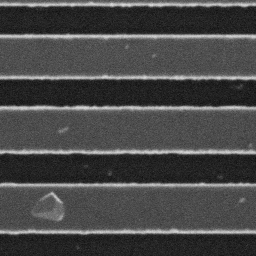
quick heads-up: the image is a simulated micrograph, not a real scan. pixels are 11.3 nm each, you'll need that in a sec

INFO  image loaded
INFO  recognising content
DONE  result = lines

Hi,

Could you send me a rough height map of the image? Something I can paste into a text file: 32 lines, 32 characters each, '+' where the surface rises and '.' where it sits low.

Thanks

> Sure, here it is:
++++++++++++++++++++++++++++++++
................................
................................
................................
++++++++++++++++++++++++++++++++
++++++++++++++++++++++++++++++++
++++++++++++++++++++++++++++++++
++++++++++++++++++++++++++++++++
++++++++++++++++++++++++++++++++
++++++++++++++++++++++++++++++++
................................
................................
................................
++++++++++++++++++++++++++++++++
++++++++++++++++++++++++++++++++
++++++++++++++++++++++++++++++++
++++++++++++++++++++++++++++++++
++++++++++++++++++++++++++++++++
++++++++++++++++++++++++++++++++
................................
................................
................................
................................
++++++++++++++++++++++++++++++++
++++++++++++++++++++++++++++++++
++++++++++++++++++++++++++++++++
++++++++++++++++++++++++++++++++
++++++++++++++++++++++++++++++++
++++++++++++++++++++++++++++++++
................................
................................
................................